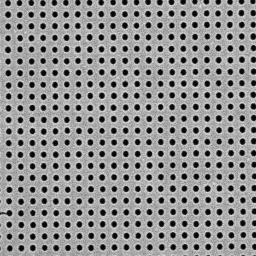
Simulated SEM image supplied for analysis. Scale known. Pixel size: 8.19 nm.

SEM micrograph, a regular array of holes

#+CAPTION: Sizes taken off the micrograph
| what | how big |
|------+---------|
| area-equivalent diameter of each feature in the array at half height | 0.0471 um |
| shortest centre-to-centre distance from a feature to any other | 92.9 nanometres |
